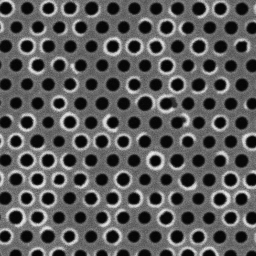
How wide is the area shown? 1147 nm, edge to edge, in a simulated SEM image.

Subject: a regular array of holes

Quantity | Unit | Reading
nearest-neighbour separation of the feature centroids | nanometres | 95.5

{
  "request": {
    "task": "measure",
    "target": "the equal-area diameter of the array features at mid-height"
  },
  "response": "57.2 nanometers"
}